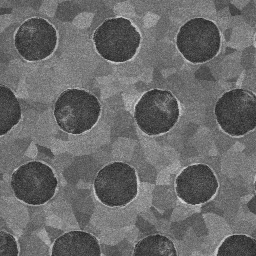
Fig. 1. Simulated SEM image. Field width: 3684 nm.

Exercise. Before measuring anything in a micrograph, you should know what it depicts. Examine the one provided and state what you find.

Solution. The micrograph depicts a regular array of holes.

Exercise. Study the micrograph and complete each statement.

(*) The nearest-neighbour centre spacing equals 1.16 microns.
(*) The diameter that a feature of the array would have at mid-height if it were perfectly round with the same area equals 650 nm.